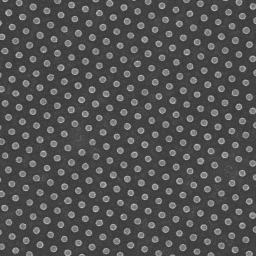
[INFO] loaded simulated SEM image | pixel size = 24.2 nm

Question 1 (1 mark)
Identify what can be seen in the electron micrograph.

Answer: a regular array of raised bodies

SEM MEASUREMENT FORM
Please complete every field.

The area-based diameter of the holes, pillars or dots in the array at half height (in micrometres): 0.154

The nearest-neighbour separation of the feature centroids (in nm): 345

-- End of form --